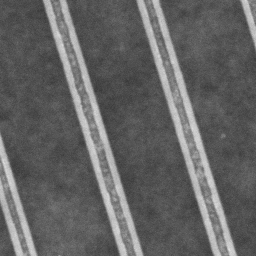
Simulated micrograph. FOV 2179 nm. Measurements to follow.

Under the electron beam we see one or a few lines or trenches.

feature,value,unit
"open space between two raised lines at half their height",642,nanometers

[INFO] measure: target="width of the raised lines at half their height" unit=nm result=125